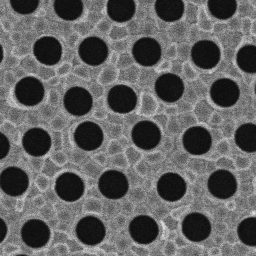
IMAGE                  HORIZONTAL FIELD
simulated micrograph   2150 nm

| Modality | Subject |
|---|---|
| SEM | a regular array of holes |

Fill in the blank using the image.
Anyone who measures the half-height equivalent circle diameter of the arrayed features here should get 29.4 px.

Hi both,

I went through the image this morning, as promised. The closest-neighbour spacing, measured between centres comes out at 44.6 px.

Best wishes